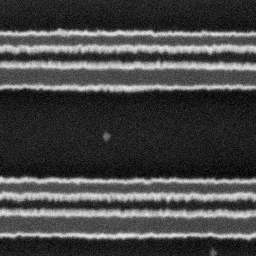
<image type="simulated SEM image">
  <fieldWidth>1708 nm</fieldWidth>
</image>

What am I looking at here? lines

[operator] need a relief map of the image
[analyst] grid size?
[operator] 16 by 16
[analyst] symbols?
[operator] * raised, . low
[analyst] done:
................
................
****************
****************
****************
................
................
................
................
................
................
****************
****************
****************
****************
................